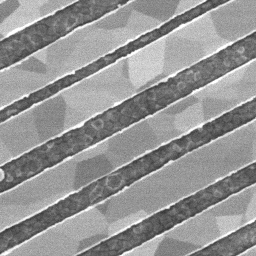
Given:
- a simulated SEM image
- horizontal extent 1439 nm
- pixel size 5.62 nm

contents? parallel lines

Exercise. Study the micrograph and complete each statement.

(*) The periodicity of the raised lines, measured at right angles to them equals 311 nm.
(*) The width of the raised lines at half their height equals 201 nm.